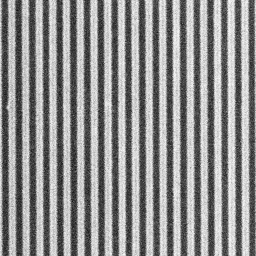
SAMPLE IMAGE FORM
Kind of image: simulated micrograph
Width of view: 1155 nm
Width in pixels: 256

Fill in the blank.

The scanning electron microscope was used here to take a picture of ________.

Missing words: parallel lines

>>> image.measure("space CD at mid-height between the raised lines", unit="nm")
34.4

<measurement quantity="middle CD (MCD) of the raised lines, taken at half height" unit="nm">25.9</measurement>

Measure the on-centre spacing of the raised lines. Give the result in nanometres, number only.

61.9